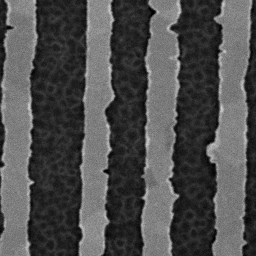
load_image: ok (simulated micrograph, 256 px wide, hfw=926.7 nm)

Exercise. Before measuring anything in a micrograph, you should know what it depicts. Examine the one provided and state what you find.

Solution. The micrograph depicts one or a few lines or trenches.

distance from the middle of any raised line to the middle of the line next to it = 257 nanometers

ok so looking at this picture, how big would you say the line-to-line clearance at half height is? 155 nanometers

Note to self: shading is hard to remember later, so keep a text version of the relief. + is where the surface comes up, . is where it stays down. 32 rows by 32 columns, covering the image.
.+++.......+++.....+++......+++.
.+++.......+++.....+++......+++.
.+++.......+++.....+++.....++++.
.+++.......+++.....++.......+++.
.++++......+++.....+++......+++.
.++++......+++.....+++......+++.
.+++.......+++....++++......++++
.+++.......+++....++++.....++++.
++++.......+++....++++.....++++.
++++.......+++.....+++.....+++..
++++.......+++.....+++......++..
++++.......+++....++++.....++++.
++++......++++....++++.....++++.
++++.......++.....++++......+++.
++++.......++.....++++.....++++.
++++.......+++....++++.....++++.
.+++.......+++....++++.....++++.
.+++......++++....++++.....++++.
++++......++++....++++....+++++.
++++......+++.....+++.....+++++.
.++.......+++.....++++.....++++.
+++.......+++.....+++......++++.
++++......+++.....+++......++++.
++++......+++.....+++......++++.
++++......+++.....++++.....++++.
++++......+++.....++++.....++++.
++++......+++.....++++.....++++.
.+++......+++.....++++.....+++..
+++.......+++.....+++......++++.
+++.......+++.....+++......+++..
++++......+++.....+++......++++.
++++......+++.....+++......+++..